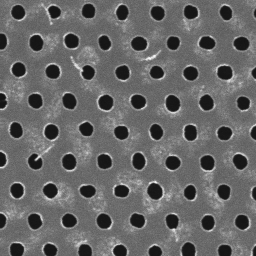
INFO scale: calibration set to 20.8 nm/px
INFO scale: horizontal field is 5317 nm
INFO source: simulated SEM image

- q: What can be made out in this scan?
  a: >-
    a regular array of holes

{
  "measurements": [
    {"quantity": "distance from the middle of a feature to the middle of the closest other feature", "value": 696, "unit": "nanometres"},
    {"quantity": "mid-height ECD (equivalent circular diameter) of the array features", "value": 14.8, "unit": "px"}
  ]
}